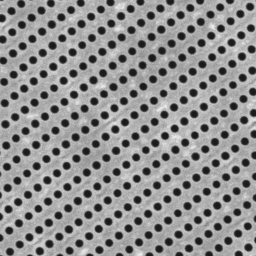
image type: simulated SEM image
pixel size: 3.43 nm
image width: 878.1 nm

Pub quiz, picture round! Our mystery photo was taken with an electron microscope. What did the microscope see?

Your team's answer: a regular array of holes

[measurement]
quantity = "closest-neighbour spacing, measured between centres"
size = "41 nanometres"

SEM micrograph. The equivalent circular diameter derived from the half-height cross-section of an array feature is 26.8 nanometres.